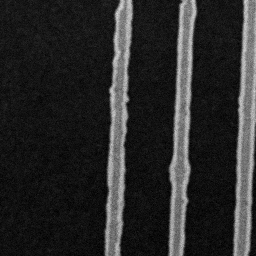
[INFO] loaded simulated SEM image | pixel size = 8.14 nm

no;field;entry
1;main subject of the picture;one or a few lines or trenches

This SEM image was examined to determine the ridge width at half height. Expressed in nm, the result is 91.5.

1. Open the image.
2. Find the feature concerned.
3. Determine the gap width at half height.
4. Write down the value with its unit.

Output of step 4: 431 nm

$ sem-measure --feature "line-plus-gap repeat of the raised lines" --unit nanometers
522